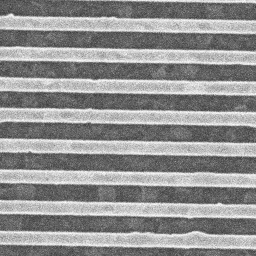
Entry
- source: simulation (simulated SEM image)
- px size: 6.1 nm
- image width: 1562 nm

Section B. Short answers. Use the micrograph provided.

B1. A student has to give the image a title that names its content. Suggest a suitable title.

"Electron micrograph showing parallel lines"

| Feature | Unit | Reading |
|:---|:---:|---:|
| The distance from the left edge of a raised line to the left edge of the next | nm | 187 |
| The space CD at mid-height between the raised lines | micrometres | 0.11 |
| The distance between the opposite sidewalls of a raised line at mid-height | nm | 76.3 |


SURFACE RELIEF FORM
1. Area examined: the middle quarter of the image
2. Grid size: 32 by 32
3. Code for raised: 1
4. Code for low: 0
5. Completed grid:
00000000000000000000000000000000
00000000000000000000000000000000
00000000000000000000000000000000
00000000000000000000000000000000
11111111111111111111111111111111
11111111111111111111111111111111
11111111111111111111111111111111
00000000000000000000000000000000
00000000000000000000000000000000
00000000000000000000000000000000
00000000000000000000000000000000
11100110000000000000000000000000
11111111111111111111111111111111
11111111111111111111111111111111
00000000111111111111111111111111
00000000000000000000000000000000
00000000000000000000000000000000
00000000000000000000000000000000
00000000000000000000000000000000
11111111111111111100000000000000
11111111111111111111111111111111
11111111111111111111111111111111
00000000000000000011111100111111
00000000000000000000000000000000
00000000000000000000000000000000
00000000000000000000000000000000
00000000000000000000000000000000
11111111111111111111111111111111
11111111111111111111111111111111
11111111111111111111111111111111
00000000000000000000000000000000
00000000000000000000000000000000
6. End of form